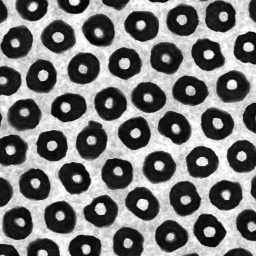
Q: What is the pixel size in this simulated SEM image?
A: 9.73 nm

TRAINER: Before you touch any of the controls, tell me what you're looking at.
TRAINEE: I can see a regular array of ring-shaped grooves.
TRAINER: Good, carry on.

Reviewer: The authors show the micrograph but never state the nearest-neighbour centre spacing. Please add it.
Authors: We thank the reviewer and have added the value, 0.387 microns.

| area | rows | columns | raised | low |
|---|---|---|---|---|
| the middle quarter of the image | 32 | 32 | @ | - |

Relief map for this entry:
@---@@---@@---@@---@@@-------@@@
@---@@---@@--------@@@@-----@@@@
@--------@@@------@@@@@@@@-@@@@@
@-------@@@@@@--@@@@@@@@@@@@@---
@@-----@@@@@@@@@@@@@@@@@@@@@----
@@@@@@@@@@@@@@@@@@------@@@-----
@@@@@@@@@@---@@@@@------@@@---@@
--@@@@@@@-----@@@---@@---@@----@
-----@@@---@---@@---@@----@@----
-----@@@--@@----@---@@----@@@---
@@----@@--@@----@@-------@@@@@@@
@----@@@-------@@@@-----@@@@@@@@
-----@@@@-----@@@@@@@@@@@----@@@
----@@@@@@---@@@@@--@@@@------@@
-@@@@@--@@@@@@@------@@@-------@
@@@@@@----@@@@-------@@----@@--@
@@@@@-----@@@@---@@--@@@---@@---
@@@@------@@@----@@---@@--------
@@@---@@---@@@---@----@@@@-----@
-@@---@@---@@@@------@@@@@@---@@
-@@--------@@@@@----@@@@@@@@@@@@
-@@-------@@@@@@@-@@@@@@@@@@@@@@
@@@@-----@@@@@@@@@@@@@----@@@@@-
@@@@@---@@@@@@@@@@@@@------@@@--
@@@@@@@@@@@-----@@@@---@@---@@@-
-----@@@@@-------@@@---@@---@@@-
-----@@@@@--@@---@@@---@@---@@@-
------@@@---@@@--@@@-------@@@@-
--@@@--@@--------@@@@------@@@@@
---@---@@@-------@@@@@--@@@@@---
------@@@@@-----@@@@@@@@@@@-----
@-----@@@@@@@@@@@----@@@@@@-----